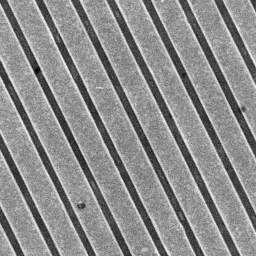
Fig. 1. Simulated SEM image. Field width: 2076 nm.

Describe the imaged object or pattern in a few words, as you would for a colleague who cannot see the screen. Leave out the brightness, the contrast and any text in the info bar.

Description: parallel lines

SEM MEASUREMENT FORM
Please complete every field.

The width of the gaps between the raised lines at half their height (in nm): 62.8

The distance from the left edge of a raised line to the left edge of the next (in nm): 262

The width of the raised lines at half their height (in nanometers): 195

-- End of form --